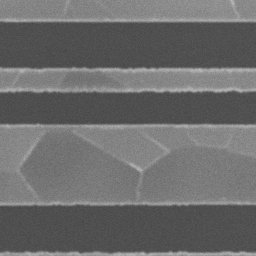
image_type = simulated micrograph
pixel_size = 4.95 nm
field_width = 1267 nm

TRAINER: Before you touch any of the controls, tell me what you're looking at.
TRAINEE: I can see lines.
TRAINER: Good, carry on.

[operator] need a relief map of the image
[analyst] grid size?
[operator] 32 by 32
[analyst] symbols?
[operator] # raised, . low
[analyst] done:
################################
################################
################################
................................
................................
................................
................................
................................
................................
################################
################################
................................
................................
................................
................................
................................
################################
################################
################################
################################
################################
################################
################################
################################
################################
.##..##.#...#...................
................................
................................
................................
................................
................................
................................